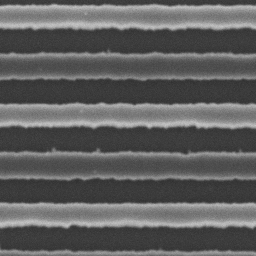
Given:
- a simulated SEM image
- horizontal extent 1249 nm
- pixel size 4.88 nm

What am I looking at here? lines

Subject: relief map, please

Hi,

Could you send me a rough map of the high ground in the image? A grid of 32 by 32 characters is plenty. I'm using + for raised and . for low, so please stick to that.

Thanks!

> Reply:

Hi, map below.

................................
++++++++++++++++++++++++++++++++
++++++++++++++++++++++++++++++++
+++.+++..+++...+.++++++..+++++.+
................................
................................
................................
++++++++++++++++++++++++++++++++
++++++++++++++++++++++++++++++++
++++++++++++++++++++++++++++++++
................................
................................
................................
++++++++++++++++++++++++++++++++
++++++++++++++++++++++++++++++++
++++++++++++++++++++++++++++++++
................................
................................
................................
++++++++++++++++++++++++++++++++
++++++++++++++++++++++++++++++++
++++++++++++++++++++++++++++++++
................................
................................
................................
+++.+++.+++.....+....+++++.+.+++
++++++++++++++++++++++++++++++++
++++++++++++++++++++++++++++++++
................................
................................
................................
+++++++++++++++++++++++.++++++++